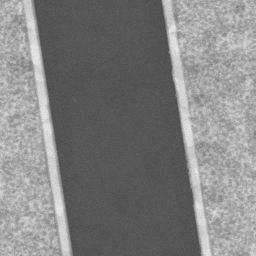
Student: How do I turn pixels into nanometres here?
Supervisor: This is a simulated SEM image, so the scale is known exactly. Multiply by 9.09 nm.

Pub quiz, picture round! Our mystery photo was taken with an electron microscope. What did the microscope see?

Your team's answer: one or a few lines or trenches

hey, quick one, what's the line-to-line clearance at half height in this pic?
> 139 px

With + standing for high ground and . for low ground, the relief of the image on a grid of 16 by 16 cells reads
++.........+++++
++.........+++++
++.........+++++
++.........+++++
++.........+++++
+++........+++++
+++.........++++
+++.........++++
+++.........++++
+++.........++++
+++.........++++
+++.........++++
++++........++++
++++.........+++
++++.........+++
++++.........+++